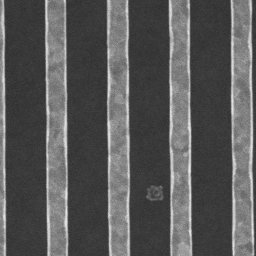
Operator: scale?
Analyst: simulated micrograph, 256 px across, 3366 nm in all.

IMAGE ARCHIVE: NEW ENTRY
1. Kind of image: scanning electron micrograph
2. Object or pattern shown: wiring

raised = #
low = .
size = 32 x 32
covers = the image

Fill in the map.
......##......##.....###.....##.
......##......##.....###.....##.
......##......##.....###.....##.
......##......##.....###.....##.
......##......##.....###.....##.
......##......##.....###.....##.
......##......##.....###.....##.
......##......##.....###.....##.
......##......##.....###.....##.
......##......##.....###.....##.
......##......##.....###.....##.
......##......##.....###.....##.
......##......##.....###.....##.
......##......##.....###.....##.
......##......##.....###.....##.
......##......##.....###.....##.
#.....##......##.....###.....##.
......##......##.....###.....##.
......##......##.....###.....##.
......##......##.....###.....##.
......##......##......##.....##.
......##......##......##.....##.
......##......##......##.....##.
#.....##......##.....###.....##.
#.....##......##...#.###.....##.
#.....##......##.....###.....###
......##......##.....###.....###
#.....##......##......##.....###
#.....##......##......##.....###
#.....##......##.....###.....###
#.....##......##.....###.....###
#.....##......##.....###.....###